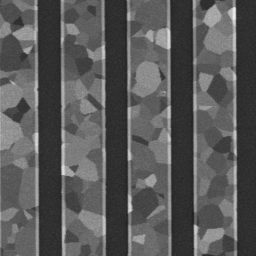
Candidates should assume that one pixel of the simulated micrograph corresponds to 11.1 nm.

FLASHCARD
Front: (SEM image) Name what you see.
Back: one or a few lines or trenches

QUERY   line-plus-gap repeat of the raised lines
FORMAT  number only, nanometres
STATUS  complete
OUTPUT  733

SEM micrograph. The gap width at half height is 0.288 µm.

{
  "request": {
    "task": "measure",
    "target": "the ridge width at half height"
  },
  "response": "453 nm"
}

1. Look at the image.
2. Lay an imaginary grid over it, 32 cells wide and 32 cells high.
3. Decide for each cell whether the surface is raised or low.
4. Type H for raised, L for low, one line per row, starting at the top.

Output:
HHHHLLLLHHHHHLLLHHHHHLLLHHHHHLLL
HHHHLLLLHHHHHLLLHHHHHLLLHHHHHLLL
HHHHLLLLHHHHHLLLHHHHHLLLHHHHHLLL
HHHHLLLLHHHHHLLLHHHHHLLLHHHHHLLL
HHHHLLLLHHHHHLLLHHHHHLLLHHHHHLLL
HHHHLLLLHHHHHLLLHHHHHLLLHHHHHLLL
HHHHLLLLHHHHHLLLHHHHHLLLHHHHHLLL
HHHHLLLLHHHHHLLLHHHHHLLLHHHHHLLL
HHHHLLLLHHHHHLLLHHHHHLLLHHHHHLLL
HHHHHLLLHHHHHLLLHHHHHLLLHHHHHLLL
HHHHHLLLHHHHHLLLHHHHHLLLHHHHHLLL
HHHHHLLLHHHHHLLLHHHHHLLLHHHHHLLL
HHHHHLLLHHHHHLLLHHHHHLLLHHHHHLLL
HHHHHLLLHHHHHLLLHHHHHLLLHHHHHLLL
HHHHHLLLHHHHHLLLHHHHHLLLHHHHHLLL
HHHHHLLLHHHHHLLLHHHHHLLLHHHHHLLL
HHHHHLLLHHHHHLLLHHHHHLLLHHHHHLLL
HHHHHLLLHHHHHLLLHHHHHLLLHHHHHLLL
HHHHHLLLHHHHHLLLHHHHHLLLHHHHHLLL
HHHHHLLLHHHHHLLLHHHHHLLLHHHHHLLL
HHHHHLLLHHHHHLLLHHHHHLLLHHHHHLLL
HHHHHLLLHHHHHLLLHHHHHLLLHHHHHLLL
HHHHHLLLHHHHHLLLHHHHHLLLHHHHHLLL
HHHHHLLLHHHHHLLLHHHHHLLLHHHHHLLL
HHHHHLLLHHHHHLLLHHHHHLLLHHHHHLLL
HHHHHLLLHHHHHLLLHHHHHLLLHHHHHLLL
HHHHHLLLHHHHHLLLHHHHHLLLHHHHHLLL
HHHHHLLLHHHHHLLLHHHHHLLLHHHHHLLL
HHHHHLLLHHHHHLLLHHHHHLLLLHHHHLLL
HHHHHLLLHHHHHLLLHHHHHLLLLHHHHLLL
HHHHHLLLHHHHHLLLHHHHHLLLHHHHHLLL
HHHHHLLLHHHHHLLLHHHHHLLLHHHHHLLL